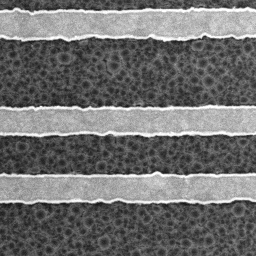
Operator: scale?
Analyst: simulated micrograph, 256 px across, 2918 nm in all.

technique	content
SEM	one or a few lines or trenches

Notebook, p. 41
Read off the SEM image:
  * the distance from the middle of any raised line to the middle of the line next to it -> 936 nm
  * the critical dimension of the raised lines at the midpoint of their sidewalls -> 0.302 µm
